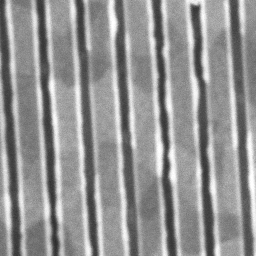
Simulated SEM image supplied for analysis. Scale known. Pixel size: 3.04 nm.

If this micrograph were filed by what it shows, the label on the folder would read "parallel lines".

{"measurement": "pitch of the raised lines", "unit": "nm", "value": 117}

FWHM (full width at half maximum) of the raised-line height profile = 89.6 nanometres